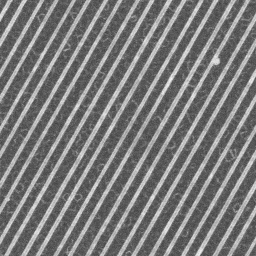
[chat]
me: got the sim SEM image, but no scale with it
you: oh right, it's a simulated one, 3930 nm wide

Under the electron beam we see parallel lines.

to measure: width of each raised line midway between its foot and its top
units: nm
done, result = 43.3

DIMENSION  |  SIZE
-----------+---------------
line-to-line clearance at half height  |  158 nanometres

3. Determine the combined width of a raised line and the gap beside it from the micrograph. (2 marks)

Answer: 212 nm